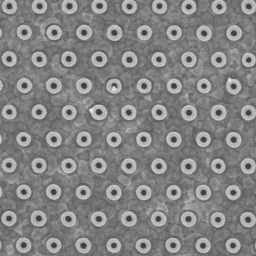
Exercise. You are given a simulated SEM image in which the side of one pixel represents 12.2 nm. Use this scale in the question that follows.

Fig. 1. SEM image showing a regular array of ring-shaped raised bodies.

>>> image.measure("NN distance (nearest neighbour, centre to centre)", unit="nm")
362